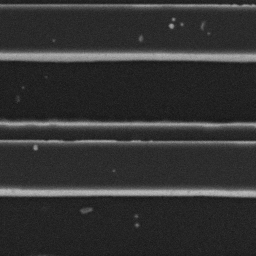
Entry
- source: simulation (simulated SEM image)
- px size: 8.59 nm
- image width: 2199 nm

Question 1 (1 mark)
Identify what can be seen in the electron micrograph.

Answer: lines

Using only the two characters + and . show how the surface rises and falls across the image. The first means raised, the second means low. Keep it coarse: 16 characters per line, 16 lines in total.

++++++++++++++++
++++++++++++++++
++++++++++++++++
................
................
................
................
................
++++++++++++++++
++++++++++++++++
++++++++++++++++
++++++++++++++++
................
................
................
................